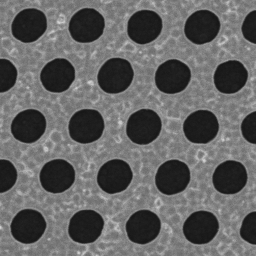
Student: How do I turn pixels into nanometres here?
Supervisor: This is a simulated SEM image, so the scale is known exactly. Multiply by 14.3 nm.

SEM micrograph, a regular array of holes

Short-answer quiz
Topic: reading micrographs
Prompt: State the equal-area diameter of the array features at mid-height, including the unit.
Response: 501 nanometres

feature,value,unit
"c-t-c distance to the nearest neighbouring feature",820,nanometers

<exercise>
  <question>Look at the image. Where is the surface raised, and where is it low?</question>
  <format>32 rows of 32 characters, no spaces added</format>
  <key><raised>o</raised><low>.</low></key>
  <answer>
oooooooooooooooooooooooooooooooo
oo...ooooo..ooooo..ooooo..ooooo.
oo....ooo....ooo....ooo....oooo.
o.....ooo....ooo....ooo.....oo..
oo...oooo....ooo....ooo....ooo..
ooooooooooooooooo.oooooooooooooo
oooooooooooooooooooooooooooooooo
.oooooo.ooooo...ooooo.oooooooooo
..ooo....oooo....ooo....ooo....o
..ooo....ooo.....oo.....ooo....o
..ooo....ooo....ooo.....ooo....o
.oooooooooooo..ooooo..oooooo..oo
oooooooooooooooooooooooooooooooo
oooooooooooooooooooooooooooooooo
oo....ooo....ooo....oooo...oooo.
o.....ooo....ooo....ooo....ooo..
o.....ooo....ooo....ooo....ooo..
oo...oooo...oooo...ooooo..ooooo.
oooooooooooooooooooooooooooooooo
oooooooooooooooooooooooooooooooo
..oooo...oooo...oooo...ooooo..oo
..ooo....ooo....oooo....ooo....o
..ooo....ooo....ooo.....ooo....o
.oooo....oooo...oooo...oooo...oo
oooooooooooooooooooooooooooooooo
oooooooooooooooooooooooooooooooo
oo...ooooo..ooooo..ooooo..ooooo.
oo....ooo....ooo....ooo....ooo..
o.....ooo....ooo....ooo....ooo..
oo...oooo...oooo....ooo....ooo..
ooooooooooooooooooooooooo.ooooo.
oooooooooooooooooooooooooooooooo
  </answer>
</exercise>